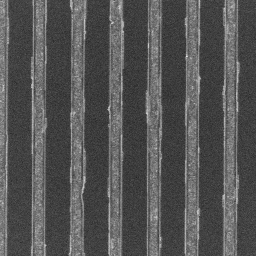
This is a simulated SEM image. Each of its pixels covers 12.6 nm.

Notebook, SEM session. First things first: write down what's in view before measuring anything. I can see parallel lines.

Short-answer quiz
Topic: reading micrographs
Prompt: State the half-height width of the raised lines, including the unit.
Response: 331 nanometres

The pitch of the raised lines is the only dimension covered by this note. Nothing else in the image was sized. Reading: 482 nm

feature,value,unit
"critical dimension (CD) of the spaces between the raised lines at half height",0.154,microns